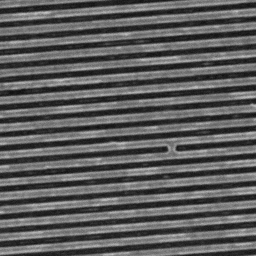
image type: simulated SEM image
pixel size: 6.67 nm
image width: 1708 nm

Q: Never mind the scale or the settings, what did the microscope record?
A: parallel lines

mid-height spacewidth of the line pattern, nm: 47.3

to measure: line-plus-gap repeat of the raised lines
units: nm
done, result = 91.1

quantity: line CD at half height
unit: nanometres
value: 41.5